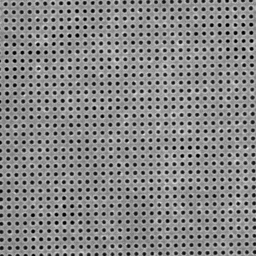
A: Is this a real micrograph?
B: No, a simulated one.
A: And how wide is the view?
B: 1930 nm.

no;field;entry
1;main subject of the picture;a regular array of holes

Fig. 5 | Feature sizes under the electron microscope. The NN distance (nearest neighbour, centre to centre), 7.59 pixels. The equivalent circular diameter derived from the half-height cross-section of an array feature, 31.8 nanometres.